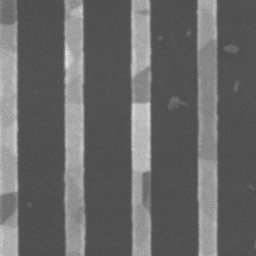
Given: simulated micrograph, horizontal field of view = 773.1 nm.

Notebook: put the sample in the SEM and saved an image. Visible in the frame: wiring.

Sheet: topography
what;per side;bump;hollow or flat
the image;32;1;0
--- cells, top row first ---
11000000010000000100000001100000
11000000110000000110000001100000
11000000110000000110000001100000
11000000110000000110000001100000
11000000110000000110000001100000
11000000110000000110000001100000
11000000110000000110000001100000
11000000110000000010000001100000
11000000110000000110000001100000
11000000110000000110000001100000
11000000110000000110000001100000
11000000110000000110000001100000
11000000110000000110010001100000
11000000110000000110000001100000
11000000110000000110000001100000
11000000110000000110000001100000
11000000110000000110000001100000
11000000110000000110000001100000
11000000110000000110000001100000
11000000110000000110000001100000
11000000110000000110000001100000
11000000110000000110000001100000
11000000110000000110000001100000
11000000110000000110000001100000
11000000110000000110000001100000
11000000110000000110000001100000
11000000110000000110000001100000
11000000110000000110000001100000
11000000110000000110000001100000
11000000110000000110000001100000
11000000110000000110000001100000
11000000110000000110000001100000